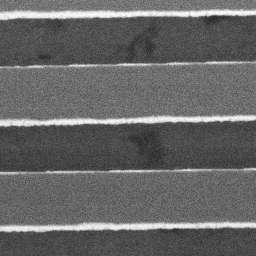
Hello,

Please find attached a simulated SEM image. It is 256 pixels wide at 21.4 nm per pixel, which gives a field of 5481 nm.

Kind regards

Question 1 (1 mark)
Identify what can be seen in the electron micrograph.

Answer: lines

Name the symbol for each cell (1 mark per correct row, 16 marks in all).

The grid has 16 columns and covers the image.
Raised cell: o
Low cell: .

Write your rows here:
oooooooooooooooo
................
................
................
oooooooooooooooo
oooooooooooooooo
oooooooooooooooo
oooooooooooooo..
................
................
................
oooooooooooooooo
oooooooooooooooo
oooooooooooooooo
................
................